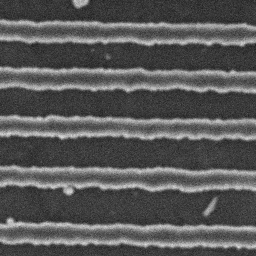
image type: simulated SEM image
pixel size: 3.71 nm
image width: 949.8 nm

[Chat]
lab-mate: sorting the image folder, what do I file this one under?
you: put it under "lines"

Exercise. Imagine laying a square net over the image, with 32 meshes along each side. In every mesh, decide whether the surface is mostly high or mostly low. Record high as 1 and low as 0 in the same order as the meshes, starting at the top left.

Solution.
00000000011000000000000000000000
00000000000000000000000000000000
00000000000000000000000000000000
11111111111111111111111111111111
11111111111111111111111111111111
00000000000000000010000000001110
00000000000000000000000000000000
00000000000000000000000000000000
00000000000000000000000000000000
11111111111111111111111111111111
11111111111111111111111111111111
00000000000000000000000000000000
00000000000000000000000000000000
00000000000000000000000000000000
00000000000000000000000000000000
11111111111111111111111111111111
11111111111111111111111111111111
00000000000000000000000000000000
00000000000000000000000000000000
00000000000000000000000000000000
00000000000000000000000000000000
11111111111111111111111101111100
11111111111111111111111111111111
00000000100001100011111111111111
00000000000000000000000000000000
00000000000000000000000000000000
00000000000000000000000000000000
00000000000000000000000000000000
11111111111111111111111111111111
11111111111111111111111111111111
00000000000000000111111111111111
00000000000000000000000000000000